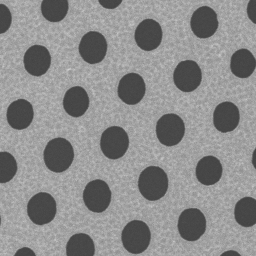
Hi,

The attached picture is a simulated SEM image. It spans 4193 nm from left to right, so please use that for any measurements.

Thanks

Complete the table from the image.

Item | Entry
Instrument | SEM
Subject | a regular array of holes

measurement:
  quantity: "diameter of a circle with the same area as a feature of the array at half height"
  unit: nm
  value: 505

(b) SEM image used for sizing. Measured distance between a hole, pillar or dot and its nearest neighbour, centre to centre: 0.921 micrometres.